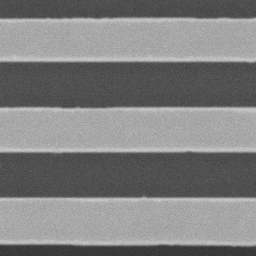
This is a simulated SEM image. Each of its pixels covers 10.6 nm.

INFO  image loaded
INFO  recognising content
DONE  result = lines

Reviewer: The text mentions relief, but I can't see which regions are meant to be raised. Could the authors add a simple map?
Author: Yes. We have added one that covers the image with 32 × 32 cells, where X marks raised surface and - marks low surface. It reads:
--------------------------------
--------------------------------
XXXXXXXXXXXXXXXXXXXXXXXXXXXXXXXX
XXXXXXXXXXXXXXXXXXXXXXXXXXXXXXXX
XXXXXXXXXXXXXXXXXXXXXXXXXXXXXXXX
XXXXXXXXXXXXXXXXXXXXXXXXXXXXXXXX
XXXXXXXXXXXXXXXXXXXXXXXXXXXXXXXX
XXXXXXXXXXXXXXXXXXXXXXXXXXXXXXXX
--------------------------------
--------------------------------
--------------------------------
--------------------------------
--------------------------------
XXXXXXXX------XXXXXXXXXXXXXXXXXX
XXXXXXXXXXXXXXXXXXXXXXXXXXXXXXXX
XXXXXXXXXXXXXXXXXXXXXXXXXXXXXXXX
XXXXXXXXXXXXXXXXXXXXXXXXXXXXXXXX
XXXXXXXXXXXXXXXXXXXXXXXXXXXXXXXX
XXXXXXXXXXXXXXXXXXXXXXXXXXXXXXXX
--------------------------------
--------------------------------
--------------------------------
--------------------------------
--------------------------------
--------------------------------
XXXXXXXXXXXXXXXXXXXXXXXXXXXXXXXX
XXXXXXXXXXXXXXXXXXXXXXXXXXXXXXXX
XXXXXXXXXXXXXXXXXXXXXXXXXXXXXXXX
XXXXXXXXXXXXXXXXXXXXXXXXXXXXXXXX
XXXXXXXXXXXXXXXXXXXXXXXXXXXXXXXX
XXXXXXXXXXXXXXXXXXXXXXXXXXXXXXXX
--------------------------------